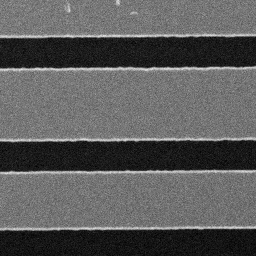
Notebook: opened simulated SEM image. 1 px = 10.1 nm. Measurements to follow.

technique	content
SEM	lines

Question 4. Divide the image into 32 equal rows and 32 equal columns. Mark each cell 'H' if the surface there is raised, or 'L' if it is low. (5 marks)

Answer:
HHHHHHHHHHHHHHHHHHHHHHHHHHHHHHHH
HHHHHHHHHHHHHHHHHHHHHHHHHHHHHHHH
HHHHHHHHHHHHHHHHHHHHHHHHHHHHHHHH
HHHHHHHHHHHHHHHHHHHHHHHHHHHHHHHH
HHHHHHHHHHHHHHHHHHHHHHHHHLLLHHLL
LLLLLLLLLLLLLLLLLLLLLLLLLLLLLLLL
LLLLLLLLLLLLLLLLLLLLLLLLLLLLLLLL
LLLLLLLLLLLLLLLLLLLLLLLLLLLLLLLL
LLLLLLLLLLLLLLLHHLLHLLLHHLHHHHHH
HHHHHHHHHHHHHHHHHHHHHHHHHHHHHHHH
HHHHHHHHHHHHHHHHHHHHHHHHHHHHHHHH
HHHHHHHHHHHHHHHHHHHHHHHHHHHHHHHH
HHHHHHHHHHHHHHHHHHHHHHHHHHHHHHHH
HHHHHHHHHHHHHHHHHHHHHHHHHHHHHHHH
HHHHHHHHHHHHHHHHHHHHHHHHHHHHHHHH
HHHHHHHHHHHHHHHHHHHHHHHHHHHHHHHH
HHHHHHHHHHHHHHHHHHHHHHHHHHHHHHHH
HHHHHHHHHHHHHHHHHHHHHHHHHHHHHHHH
LLLLLLLLLLLLLLLLLLLLLLLLLLLLLLLL
LLLLLLLLLLLLLLLLLLLLLLLLLLLLLLLL
LLLLLLLLLLLLLLLLLLLLLLLLLLLLLLLL
LHLHHHHHHHHHHHHHHHHHHHHHHHHHHHHH
HHHHHHHHHHHHHHHHHHHHHHHHHHHHHHHH
HHHHHHHHHHHHHHHHHHHHHHHHHHHHHHHH
HHHHHHHHHHHHHHHHHHHHHHHHHHHHHHHH
HHHHHHHHHHHHHHHHHHHHHHHHHHHHHHHH
HHHHHHHHHHHHHHHHHHHHHHHHHHHHHHHH
HHHHHHHHHHHHHHHHHHHHHHHHHHHHHHHH
HHHHHHHHHHHHHHHHHHHHHHHHHHHHHHHH
LLLLLLLLLLLLLLLLLLLLLLLLLLLLLLLL
LLLLLLLLLLLLLLLLLLLLLLLLLLLLLLLL
LLLLLLLLLLLLLLLLLLLLLLLLLLLLLLLL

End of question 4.